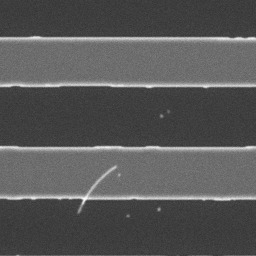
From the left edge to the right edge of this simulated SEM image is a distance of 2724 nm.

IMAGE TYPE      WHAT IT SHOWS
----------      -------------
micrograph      lines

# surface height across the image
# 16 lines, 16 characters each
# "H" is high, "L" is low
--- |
LLLLLLLLLLLLLLLL
LLLLLLLLLLLLLLLL
HHHHHHHHHHHHHHHH
HHHHHHHHHHHHHHHH
HHHHHHHHHHHHHHHH
LLLLLLLLLLLLLLLL
LLLLLLLLLLLLLLLL
LLLLLLLLLLLLLLLL
LLLLLLLLLLLLLLLL
HHHHHHHHHHHHHHHH
HHHHHHHHHHHHHHHH
HHHHHHHHHHHHHHHH
LLLLLLLLLLLLLLLL
LLLLLLLLLLLLLLLL
LLLLLLLLLLLLLLLL
LLLLLLLLLLLLLLLL